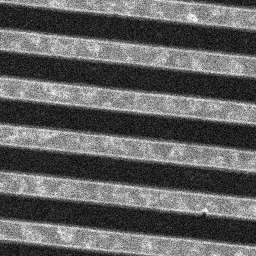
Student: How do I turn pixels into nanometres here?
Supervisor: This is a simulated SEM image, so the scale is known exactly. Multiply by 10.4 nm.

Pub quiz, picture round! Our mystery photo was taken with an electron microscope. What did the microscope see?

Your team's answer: parallel lines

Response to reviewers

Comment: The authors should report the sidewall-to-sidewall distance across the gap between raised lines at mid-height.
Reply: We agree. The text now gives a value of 274 nm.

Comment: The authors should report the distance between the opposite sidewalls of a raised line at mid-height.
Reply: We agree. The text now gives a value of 219 nanometres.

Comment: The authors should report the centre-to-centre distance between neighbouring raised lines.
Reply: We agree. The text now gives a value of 492 nm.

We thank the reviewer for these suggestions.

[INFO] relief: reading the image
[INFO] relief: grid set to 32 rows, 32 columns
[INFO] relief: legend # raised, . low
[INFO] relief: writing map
..########################......
..........######################
....................############
..............................##
########........................
#################...............
..########################......
............####################
.....................###########
..............................##
########........................
#################...............
...########################.....
...........#####################
......................##########
...............................#
#########.......................
###################.............
....########################....
.............###################
......................##########
#...............................
##########......................
###################.............
....#########################...
..............##################
......................##########
#...............................
###########.....................
####################............
.....########################...
..............##################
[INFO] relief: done